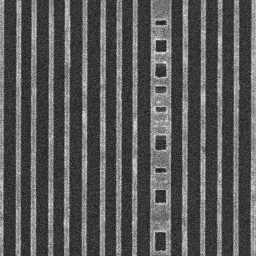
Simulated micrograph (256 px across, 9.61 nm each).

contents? parallel lines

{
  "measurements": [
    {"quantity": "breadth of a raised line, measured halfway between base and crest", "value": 3.87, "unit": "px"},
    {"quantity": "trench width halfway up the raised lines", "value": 125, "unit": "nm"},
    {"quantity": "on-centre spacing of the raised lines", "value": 161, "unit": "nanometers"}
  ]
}